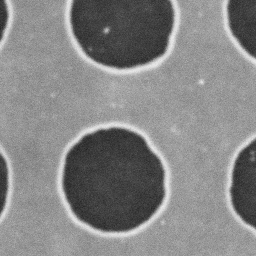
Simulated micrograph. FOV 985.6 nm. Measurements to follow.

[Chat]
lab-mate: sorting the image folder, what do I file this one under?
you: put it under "holes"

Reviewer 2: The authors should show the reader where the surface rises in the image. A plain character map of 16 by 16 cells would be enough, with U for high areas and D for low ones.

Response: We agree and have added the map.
UUUUDDDDDDDUUUDD
UUUUDDDDDDDUUUDD
UUUUUDDDDDDUUUUD
UUUUUDDDDDUUUUUU
UUUUUUUUUUUUUUUU
UUUUUUUUUUUUUUUU
UUUUUUUUUUUUUUUU
UUUUUUUUUUUUUUUU
UUUUUDDDDUUUUUUU
UUUUDDDDDDUUUUUD
UUUUDDDDDDUUUUUD
DUUUDDDDDDUUUUDD
UUUUDDDDDDUUUUDD
UUUUUDDDDDUUUUUD
UUUUUUDDUUUUUUUU
UUUUUUUUUUUUUUUU